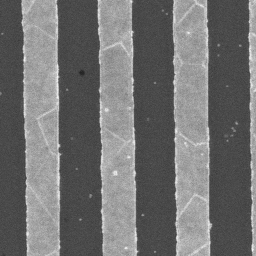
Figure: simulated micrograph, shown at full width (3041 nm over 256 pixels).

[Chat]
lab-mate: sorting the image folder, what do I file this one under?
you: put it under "lines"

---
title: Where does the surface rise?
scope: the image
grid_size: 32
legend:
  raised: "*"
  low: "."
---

...****.....****......****.....*
...****.....****......****.....*
...****.....****......****.....*
...****.....****......****.....*
...****.....****......****.....*
...****......***......****.....*
...****.....****......****.....*
...****.....****......****.....*
...****......***......****.....*
...****......****.....****.....*
...****......****.....****.....*
...****.....*****.....****.....*
...****......****.....****.....*
...****......****.....****.....*
...****......****.....****.....*
...****......****.....****.....*
...****......****.....****.....*
...****......****.....****.....*
...****......****.....****.....*
...****......****.....****.....*
...****......****.....****.....*
...****......****.....****......
...****......****.....****......
...****......****.....****.....*
...****......****.....****......
...****......****.....****......
...****......****.....****......
...****......****.....****......
...****......****.....****......
...****......****.....****......
...****......****.....****......
...****......****.....****......